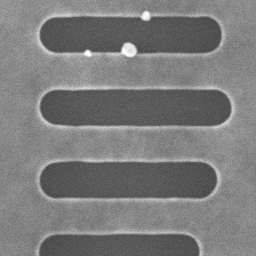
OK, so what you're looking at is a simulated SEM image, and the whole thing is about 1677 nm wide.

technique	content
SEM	groups of lines, slits or small figures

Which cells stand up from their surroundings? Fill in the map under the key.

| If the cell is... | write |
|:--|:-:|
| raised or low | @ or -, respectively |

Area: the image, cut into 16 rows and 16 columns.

@@@@@@@@@@@@@@@@
@@@-----------@@
@@@-----------@@
@@@@@@@@@@@@@@@@
@@@@@@@@@@@@@@@@
@@@@@@@@@@@@@@@@
@@@-----------@@
@@@-----------@@
@@@@@@@@@@@@@@@@
@@@@@@@@@@@@@@@@
@@@----------@@@
@@@-----------@@
@@@@@@@@@@@@@@@@
@@@@@@@@@@@@@@@@
@@@@@@@@@@@@@@@@
@@@---------@@@@